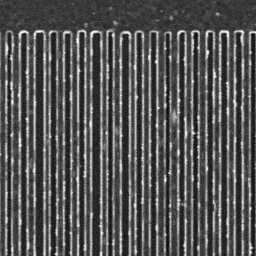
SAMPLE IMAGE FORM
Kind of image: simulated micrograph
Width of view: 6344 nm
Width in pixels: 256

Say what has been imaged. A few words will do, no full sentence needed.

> parallel lines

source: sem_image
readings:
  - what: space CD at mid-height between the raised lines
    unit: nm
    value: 164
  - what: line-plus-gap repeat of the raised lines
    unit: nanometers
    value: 357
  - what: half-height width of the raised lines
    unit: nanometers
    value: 189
